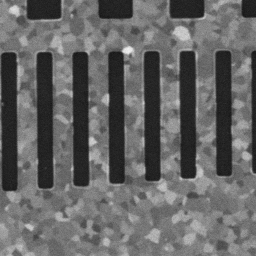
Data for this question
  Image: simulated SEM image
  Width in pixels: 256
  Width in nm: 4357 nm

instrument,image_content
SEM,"groups of lines, slits or small figures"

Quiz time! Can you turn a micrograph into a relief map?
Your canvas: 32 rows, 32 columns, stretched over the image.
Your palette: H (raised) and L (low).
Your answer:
HHHLLLLLHHHHLLLLLHHHHLLLLLHHHHLL
HHHLLLLLHHHHLLLLLHHHHLLLLLHHHHLL
HHHHLLLHHHHHHHHHHHHHHHLHHHHHHHHH
HHHHHHHHHHHHHHHHHHHHHHHHHHHHHHHH
HHHHHHHHHHHHHHHHHHHHHHHHHHHHHHHH
HHHHHHHHHHHHHHHHHHHHHHHHHHHHHHHH
HLHHHLHHHLLHHHLHHHLLHHHLHHHLLHHH
LLHHLLLHHLLHHLLLHHLLHHLLLHHLLHHL
LLHHLLLHHLLHHLLLHHLLHHLLLHHLLHHL
LLHHLLLHHLLHHLLLHHLLHHLLLHHLLHHL
LLHHLLLHHLLHHLLLHHLLHHLLLHHLLHHL
LLHHLLLHHLLHHLLLHHLLHHLLLHHLLHHL
LLHHLLLHHLLHHLLLHHLLHHLLLHHLLHHL
LLHHLLLHHLLHHLLLHHLLHHLLLHHLLHHL
LLHHLLLHHLLHHLLLHHLLHHLLLHHLLHHL
LLHHHLLHHLLHHLLLHHLLHHLLLHHLLHHL
LLHHHLLHHLLHHLLLHHLLHHLLLHHLLHHL
LLHHHLLHHLLHHLLLHHLLHHLLLHHLLHHL
LLHHHLLHHLLHHLLLHHLLHHLLLHHLLHHL
LLHHHLLHHLLHHLLLHHLLHHLLLHHLLHHL
LLHHHLLHHLLHHLLLHHLLHHLLLHHLLHHL
LLHHHLLHHLLHHLLLHHLLHHLLLHHLLHHH
LLHHHLLHHLLHHLLLHHLLHHHHHHHHHHHH
LLHHHLHHHHLHHHHHHHHHHHHHHHHHHHHH
HHHHHHHHHHHHHHHHHHHHHHHHHHHHHHHH
HHHHHHHHHHHHHHHHHHHHHHHHHHHHHHHH
HHHHHHHHHHHHHHHHHHHHHHHHHHHHHHHH
HHHHHHHHHHHHHHHHHHHHHHHHHHHHHHHH
HHHHHHHHHHHHHHHHHHHHHHHHHHHHHHHH
HHHHHHHHHHHHHHHHHHHHHHHHHHHHHHHH
HHHHHHHHHHHHHHHHHHHHHHHHHHHHHHHH
HHHHHHHHHHHHHHHHHHHHHHHHHHHHHHHH